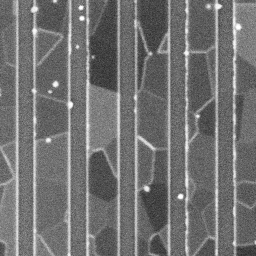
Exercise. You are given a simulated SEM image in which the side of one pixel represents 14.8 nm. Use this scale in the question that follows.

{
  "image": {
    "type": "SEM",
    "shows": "lines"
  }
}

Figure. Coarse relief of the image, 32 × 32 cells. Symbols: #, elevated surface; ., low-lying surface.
##..#####..####..####..####..###
##..#####..####..####..####..###
##..#####..####..####..####..###
##..#####..####..####..####..###
##..#####..####..####..####..###
##..#####..####..####..####..###
##..#####..####..####..####..###
##..#####..####..####..####..###
##..#####..####..####..####..###
##..#####..####..####..####..###
##..#####..####..####..####..###
##..#####..####..####..####..###
##..#####..####..####..####..###
##..#####..####..####..####..###
##..#####..####..####..####..###
##..#####..####..####..####..###
##..#####..####..####..####..###
##..#####..####..####..####..###
##..#####..####..####..####..###
##..#####..####..####..####..###
##..#####..####..####..####..###
##..#####..####..####..####..###
##..#####..####..####..####..###
##..#####..####..####..####..###
##..#####..####..####..####..###
##..#####..####..####..####..###
##..#####..####..####..####..###
##..#####..####..####..####..###
##..#####..####..####..####..###
##..#####..####..####..####..###
##..#####..####..####..####..###
##..#####..####..####..####..###